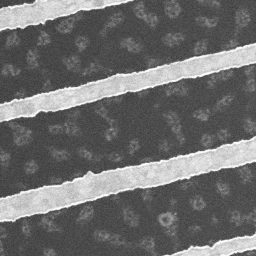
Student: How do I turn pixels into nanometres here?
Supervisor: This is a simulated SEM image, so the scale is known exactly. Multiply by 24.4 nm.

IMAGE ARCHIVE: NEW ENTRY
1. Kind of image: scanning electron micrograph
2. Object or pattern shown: one or a few lines or trenches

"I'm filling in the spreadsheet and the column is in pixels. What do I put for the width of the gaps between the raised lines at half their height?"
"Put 72.1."